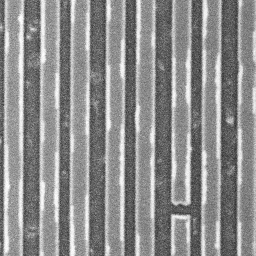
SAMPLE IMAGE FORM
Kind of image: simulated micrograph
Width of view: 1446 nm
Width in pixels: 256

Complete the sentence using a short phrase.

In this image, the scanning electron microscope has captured parallel lines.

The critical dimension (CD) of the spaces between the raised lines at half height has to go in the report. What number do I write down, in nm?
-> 96.1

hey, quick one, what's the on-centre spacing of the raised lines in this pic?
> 186 nm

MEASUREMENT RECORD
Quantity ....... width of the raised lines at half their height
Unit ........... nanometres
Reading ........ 102